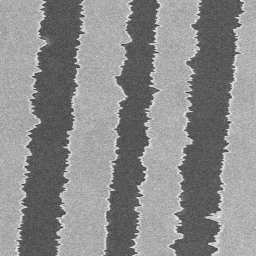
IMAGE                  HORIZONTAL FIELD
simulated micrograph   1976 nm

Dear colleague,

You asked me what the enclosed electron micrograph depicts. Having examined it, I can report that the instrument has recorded one or a few lines or trenches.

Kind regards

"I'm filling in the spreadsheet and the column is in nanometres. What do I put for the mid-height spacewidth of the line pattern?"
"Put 302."